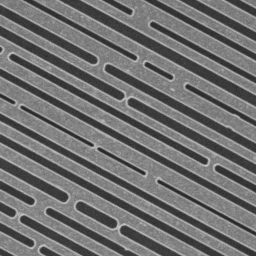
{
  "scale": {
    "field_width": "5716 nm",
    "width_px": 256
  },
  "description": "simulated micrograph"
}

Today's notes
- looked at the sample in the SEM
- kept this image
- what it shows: parallel lines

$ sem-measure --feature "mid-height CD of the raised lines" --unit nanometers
255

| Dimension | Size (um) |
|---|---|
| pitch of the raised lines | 0.432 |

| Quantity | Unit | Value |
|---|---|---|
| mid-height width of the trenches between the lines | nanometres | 174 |